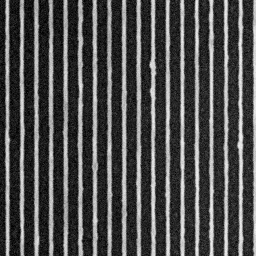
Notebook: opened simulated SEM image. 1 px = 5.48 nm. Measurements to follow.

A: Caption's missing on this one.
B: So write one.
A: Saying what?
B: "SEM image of parallel lines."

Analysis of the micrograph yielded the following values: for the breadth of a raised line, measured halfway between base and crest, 19.9 nm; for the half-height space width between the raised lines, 0.0603 microns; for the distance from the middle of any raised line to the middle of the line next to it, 79.8 nanometers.